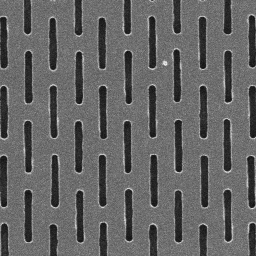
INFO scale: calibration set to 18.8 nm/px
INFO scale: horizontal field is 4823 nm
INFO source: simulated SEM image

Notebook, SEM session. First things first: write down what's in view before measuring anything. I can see a regular array of holes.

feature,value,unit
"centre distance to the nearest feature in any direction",788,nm